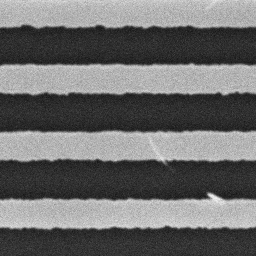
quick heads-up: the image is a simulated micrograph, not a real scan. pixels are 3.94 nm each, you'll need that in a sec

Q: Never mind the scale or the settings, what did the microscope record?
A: lines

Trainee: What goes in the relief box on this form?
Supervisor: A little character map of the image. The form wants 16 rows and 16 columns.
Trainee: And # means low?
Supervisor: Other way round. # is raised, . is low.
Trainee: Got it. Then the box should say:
################
################
................
................
################
################
................
................
################
################
................
................
#######.##.#####
################
................
................